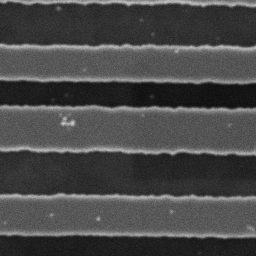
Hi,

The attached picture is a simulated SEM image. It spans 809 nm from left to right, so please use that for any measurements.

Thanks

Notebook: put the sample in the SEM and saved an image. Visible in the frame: lines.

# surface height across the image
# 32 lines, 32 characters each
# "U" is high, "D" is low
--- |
DDDDDDDDDDDDDDDDUUUDDDDDUUUUUUUU
DDDDDDDDDDDDDDDDDDDDDDDDDDDDDDDD
DDDDDDDDDDDDDDDDDDDDDDDDDDDDDDDD
DDDDDDDDDDDDDDDDDDDDDDDDDDDDDDDD
DDDDDDDDDDDDDDDDDDDDDDDDDDDDDDDD
DDDDDDDDDDDDDDDDDDDDDDDDDDDDDDDD
UUUUUUUUUUUUUUUUUUUUUUUUUUUUUUUU
UUUUUUUUUUUUUUUUUUUUUUUUUUUUUUUU
UUUUUUUUUUUUUUUUUUUUUUUUUUUUUUUU
UUUUUUUUUUUUUUUUUUUUUUUUUUUUUUUU
DDDDDDDDDDDDDDDDDDDDDDDDDDDDDDUD
DDDDDDDDDDDDDDDDDDDDDDDDDDDDDDDD
DDDDDDDDDDDDDDDDDDDDDDDDDDDDDDDD
UUUUUUUUUUUUUUUUUUUUUDUUUDDUDDDD
UUUUUUUUUUUUUUUUUUUUUUUUUUUUUUUU
UUUUUUUUUUUUUUUUUUUUUUUUUUUUUUUU
UUUUUUUUUUUUUUUUUUUUUUUUUUUUUUUU
UUUUUUUUUUUUUUUUUUUUUUUUUUUUUUUU
UUUUUUUUUUUUUUUUUUUUUUUUUUUUUUUU
DDDDDDDDDDDDDDDDDDDDDDDDDDDDDDDD
DDDDDDDDDDDDDDDDDDDDDDDDDDDDDDDD
DDDDDDDDDDDDDDDDDDDDDDDDDDDDDDDD
DDDDDDDDDDDDDDDDDDDDDDDDDDDDDDDD
DDDDDDDDDDDDDDDDDDDDDDDDDDDDDDDD
UUUUUUUUUUUUUUUDDDDDUDDDDDDDDDDD
UUUUUUUUUUUUUUUUUUUUUUUUUUUUUUUU
UUUUUUUUUUUUUUUUUUUUUUUUUUUUUUUU
UUUUUUUUUUUUUUUUUUUUUUUUUUUUUUUU
UUUUUUUUUUUUUUUUUUUUUUUUUUUUUUUU
DDDDDDDDDDDDDUUDUUUUUUUUUUUUUUUU
DDDDDDDDDDDDDDDDDDDDDDDDDDDDDDDD
DDDDDDDDDDDDDDDDDDDDDDDDDDDDDDDD